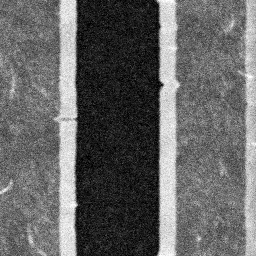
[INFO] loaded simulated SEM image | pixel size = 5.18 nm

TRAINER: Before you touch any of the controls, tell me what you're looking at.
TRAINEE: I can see one or a few lines or trenches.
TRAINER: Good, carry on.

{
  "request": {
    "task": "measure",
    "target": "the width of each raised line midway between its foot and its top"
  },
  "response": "87 px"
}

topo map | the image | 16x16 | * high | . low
****......******
****......******
****......******
****......******
****......******
****.......*****
****......******
****.......*****
****......******
****......******
****......******
****......******
****......******
****......******
****......******
****......******